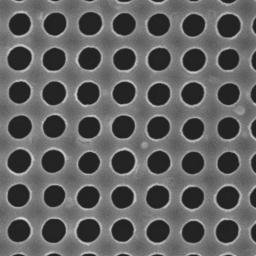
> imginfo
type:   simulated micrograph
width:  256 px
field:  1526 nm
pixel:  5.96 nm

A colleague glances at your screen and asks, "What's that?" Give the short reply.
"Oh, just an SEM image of a regular array of holes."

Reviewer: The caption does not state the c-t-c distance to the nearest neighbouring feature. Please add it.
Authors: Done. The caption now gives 202 nanometers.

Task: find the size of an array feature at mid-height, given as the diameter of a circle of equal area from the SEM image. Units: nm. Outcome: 136